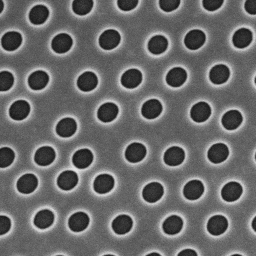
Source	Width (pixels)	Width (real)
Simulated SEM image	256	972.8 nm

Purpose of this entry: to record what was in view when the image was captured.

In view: a regular array of holes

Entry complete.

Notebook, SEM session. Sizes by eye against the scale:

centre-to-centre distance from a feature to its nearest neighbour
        36.7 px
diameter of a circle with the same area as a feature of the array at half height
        81.6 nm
